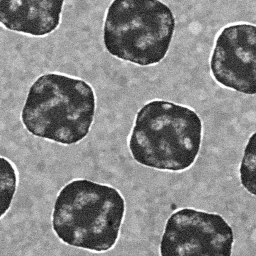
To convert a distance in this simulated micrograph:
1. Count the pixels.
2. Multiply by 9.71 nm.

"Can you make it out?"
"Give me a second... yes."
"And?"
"holes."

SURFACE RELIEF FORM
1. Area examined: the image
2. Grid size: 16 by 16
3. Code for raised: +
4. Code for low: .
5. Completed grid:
....+++...++++++
....+++....+++++
+++++++....+++..
+++++++...+++...
+++++++++++++...
++....++++++++..
++....+++..+++++
+.....++....++++
++...+++.....+++
++++++++....+++.
.+++++++++..+++.
.+++..+++++++++.
.+++....++++++++
+++.....+++...++
+++....+++....++
+++++..+++....++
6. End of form